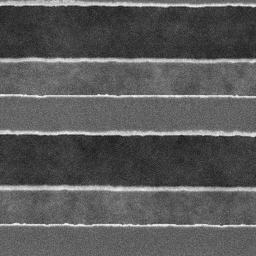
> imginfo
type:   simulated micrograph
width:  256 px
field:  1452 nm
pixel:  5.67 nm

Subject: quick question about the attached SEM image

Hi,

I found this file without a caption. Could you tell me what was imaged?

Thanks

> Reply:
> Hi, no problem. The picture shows lines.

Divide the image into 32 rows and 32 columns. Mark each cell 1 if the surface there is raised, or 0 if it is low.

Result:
11111111111111111111111111111111
00000000000000000000000000000000
00000000000000000000000000000000
00000000000000000000000000000000
00000000000000000000000000000000
00000000000000000000000000000000
00000000000000000000000000000000
00000000000000000000000000000000
11111111111111111111111111111111
11111111111111111111111111111111
11111111111111111111111111111111
11111111111111111111111111111111
11111111111111111111111111111111
11111111111111111111111111111111
11111111111111111111111111111111
11111111111111111111111111111111
11111111111111111111111111111111
00000000000000000000000000000000
00000000000000000000000000000000
00000000000000000000000000000000
00000000000000000000000000000000
00000000000000000000000000000000
00000000000000000000000000000000
00000000000000000000000000000000
11111111111111111111111111111111
11111111111111111111111111111111
11111111111111111111111111111111
11111111111111111111111111111111
11111111111111111111111111111111
11111111111111111111111111111111
11111111111111111111111111111111
11111111111111111111111111111111